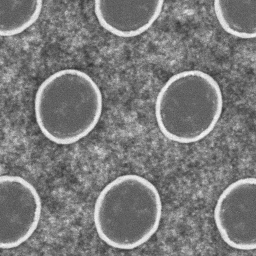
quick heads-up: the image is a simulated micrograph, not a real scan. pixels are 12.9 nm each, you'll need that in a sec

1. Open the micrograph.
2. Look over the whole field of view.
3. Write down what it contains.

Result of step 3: raised bodies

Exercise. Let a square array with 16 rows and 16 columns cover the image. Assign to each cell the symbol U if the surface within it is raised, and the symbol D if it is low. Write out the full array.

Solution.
UUDDDDUUUUDDDDUU
UUDDDDDUUDDDDDUU
DDDDDDDDDDDDDDDD
DDDDDDDDDDDDDDDD
DDDDUDDDDDDDDDDD
DDDUUUDDDDUUUDDD
DDUUUUDDDDUUUUDD
DDUUUUDDDDUUUDDD
DDDUUDDDDDDUUDDD
DDDDDDDDDDDDDDDD
DDDDDDDDDDDDDDDD
UUDDDDDUUDDDDDDU
UUDDDDUUUUDDDDUU
UUDDDDUUUUDDDDUU
UUDDDDUUUDDDDDUU
DDDDDDDDDDDDDDDD